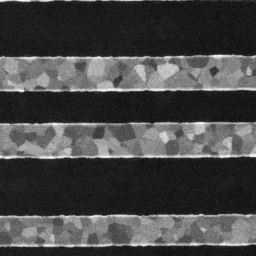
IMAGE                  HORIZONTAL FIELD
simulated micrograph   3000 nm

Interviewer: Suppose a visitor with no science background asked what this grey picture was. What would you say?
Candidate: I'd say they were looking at lines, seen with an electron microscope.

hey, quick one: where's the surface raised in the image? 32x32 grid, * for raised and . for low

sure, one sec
................................
................................
................................
................................
................................
................................
................................
********************************
********************************
********************************
********************************
................................
................................
................................
................................
..................*.**..********
********************************
********************************
********************************
*****************************...
................................
................................
................................
................................
................................
................................
................................
********************************
********************************
********************************
*************************.******
................................